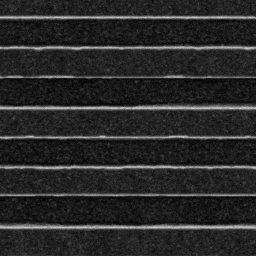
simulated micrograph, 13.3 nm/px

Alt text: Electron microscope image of lines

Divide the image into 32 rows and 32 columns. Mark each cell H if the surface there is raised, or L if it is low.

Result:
HHHHHHHHHHHHHHHHHHHHHHHHHHHHHHHH
HHHHHHHHHHHHHHHHHHHHHHHHHHHHHHHH
LLLLLLLLLLLLLLLLLLLLLLLLLLLLLLLL
LLLLLLLLLLLLLLLLLLLLLLLLLLLLLLLL
LLLLLLLLLLLLLLLLLLLLLLLLLLLLLLLL
LLLLLLLLLLLLLLLLLLLLLLLLLLLLLLLL
HHHHHHHHHHHHHHHHHHHHHHHHHHHHHHHH
HHHHHHHHHHHHHHHHHHHHHHHHHHHHHHHH
HHHHHHHHHHHHHHHHHHHHHHHHHHHHHHHH
HHHHHHHHHHHHHHHHHHHHHHHHHHHHHHHH
LLLLLLLLLLLLLLLLLLLLLLLLLLLLLLLL
LLLLLLLLLLLLLLLLLLLLLLLLLLLLLLLL
LLLLLLLLLLLLLLLLLLLLLLLLLLLLLLLL
LLLLLLLLLLLLLLLLLLLLLLLLLLLLLLLL
HHHHHHHHHHHHHHHHHHHHHHHHHHHHHHHH
HHHHHHHHHHHHHHHHHHHHHHHHHHHHHHHH
HHHHHHHHHHHHHHHHHHHHHHHHHHHHHHHH
LLLLLLLLLLLLLLLLLLLLLLLLLLLLLLLL
LLLLLLLLLLLLLLLLLLLLLLLLLLLLLLLL
LLLLLLLLLLLLLLLLLLLLLLLLLLLLLLLL
LLLLLLLLLLLLLLLLLLLLLLLLLLLLLLLL
HHHHHHHHHHHHHHHHHHHHHHHHHHHHHHHH
HHHHHHHHHHHHHHHHHHHHHHHHHHHHHHHH
HHHHHHHHHHHHHHHHHHHHHHHHHHHHHHHH
LLLLLLLLLLLLLLLLLLLLLLLLLLLLLLLL
LLLLLLLLLLLLLLLLLLLLLLLLLLLLLLLL
LLLLLLLLLLLLLLLLLLLLLLLLLLLLLLLL
LLLLLLLLLLLLLLLLLLLLLLLLLLLLLLLL
HHHHHHHHLHHHHHHHLLHHHHHHHHHHHHHH
HHHHHHHHHHHHHHHHHHHHHHHHHHHHHHHH
HHHHHHHHHHHHHHHHHHHHHHHHHHHHHHHH
HHHHHHHHHHHHHHHHHHHHHHHHHHHHHHHH